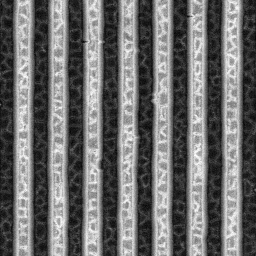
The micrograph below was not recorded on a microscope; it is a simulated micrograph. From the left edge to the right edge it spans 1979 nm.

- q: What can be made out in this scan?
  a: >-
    parallel lines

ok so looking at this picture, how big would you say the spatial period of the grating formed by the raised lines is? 269 nanometres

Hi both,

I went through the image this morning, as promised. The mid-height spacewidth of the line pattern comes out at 143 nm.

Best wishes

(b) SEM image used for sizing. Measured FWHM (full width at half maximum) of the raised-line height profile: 130 nanometres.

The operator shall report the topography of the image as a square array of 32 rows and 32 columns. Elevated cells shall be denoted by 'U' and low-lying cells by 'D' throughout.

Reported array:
DDUUDDUUDDDUUDDUUDDUUDDDUUDDUUDD
DDUUDDUUDDDUUDDUUDDUUDDDUUDDUUDD
DDUUDDUUDDDUUDDUUDDUUDDDUUDDUUDD
DDUUDDUUDDDUUDDUUDDUUDDDUUDDUUDD
DDUUDDUUDDDUUDDUUDDUUDDDUUDDUUDD
DDUUDDUUDDDUUDDUUDDUUDDDUUDDUUDD
DDUUDDUUDDDUUDDUUDDUUDDDUUDDUUDD
DDUUDDUUDDDUUDDUUDDUUDDDUUDDUUDD
DDUUDDUUDDDUUDDUUDDUUDDDUUDDUUDD
DDUUDDUUDDDUUDDUUDDUUDDDUUDDUUDD
DDUUDDUUDDDUUDDUUDDUUDDDUUDDUUDD
DDUUDDUUDDDUDDDUUDDUUDDDUUDDUUDD
DDUUDDUUDDDUDDDUUDDUUDDDUUDDUUDD
DDUUDDUUDDDUDDDUUDDUUDDDUUDDUUDD
DDUUDDUUDDDUUDDUUDDUUDDDUUDDUUDD
DDUUDDUUDDDUUDDUUDDUUDDDUUDDUUDD
DDUUDDUUDDDUDDDUUDDUUDDDUUDDUUDD
DDUUDDUUDDDUUDDUUDDUUDDDUUDDUUDD
DDUUDDUUDDDUUDDUUDDUUDDDUUDDUUDD
DDUUDDUUDDDUUDDUUDDUUDDDUUDDUUDD
DDUUDDUUDDDUDDDUUDDUUDDDUUDDUUDD
DDUUDDUUDDDUUDDUUDDUUDDDUUDDUUDD
DDUUDDUUDDDUUDDUUDDUUDDDUUDDUUDD
DDUUDDUUDDDUUDDUUDDUUDDDUUDDUUDD
DDUUDDUUDDDUUDDUUDDUUDDDUUDDUUDD
DDUUDDUUDDDUUDDUUDDUUDDDUUDDUUDD
DDUUDDUUDDDUUDDUUDDUUDDDUUDDUUDD
DDUUDDUUDDDUUDDUUDDUUDDDUUDDUUDD
DDUUDDUUDDDUUDDUUDDUUDDDUUDDUUDD
DDUUDDUUDDDUUDDUUDDUUDDDUUDDUUDD
DDUUDDUUDDDUUDDUUDDUUDDDUUDDUUDD
DDUUDDUUDDDUUDDUUDDUUDDDUUDDUUDD